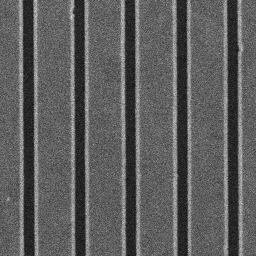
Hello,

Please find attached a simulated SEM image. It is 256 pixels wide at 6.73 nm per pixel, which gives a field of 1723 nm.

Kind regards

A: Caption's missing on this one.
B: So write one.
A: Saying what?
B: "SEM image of parallel lines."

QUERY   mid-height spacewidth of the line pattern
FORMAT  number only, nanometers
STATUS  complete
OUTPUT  86.7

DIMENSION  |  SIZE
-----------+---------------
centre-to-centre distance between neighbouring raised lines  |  344 nm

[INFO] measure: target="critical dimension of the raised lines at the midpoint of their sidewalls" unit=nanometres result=255